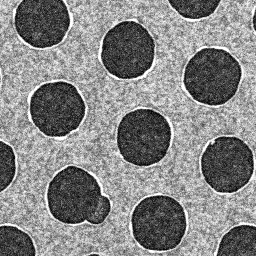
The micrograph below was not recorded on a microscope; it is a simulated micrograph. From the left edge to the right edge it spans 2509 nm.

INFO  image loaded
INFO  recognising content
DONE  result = holes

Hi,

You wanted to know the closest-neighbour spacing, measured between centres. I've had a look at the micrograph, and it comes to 862 nm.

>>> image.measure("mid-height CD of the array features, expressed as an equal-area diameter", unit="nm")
558